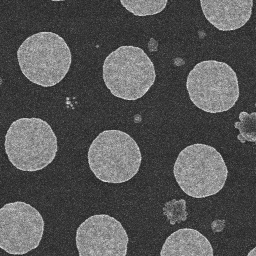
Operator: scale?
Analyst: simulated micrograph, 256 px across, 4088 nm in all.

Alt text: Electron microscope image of raised bodies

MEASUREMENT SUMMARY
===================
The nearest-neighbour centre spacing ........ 1360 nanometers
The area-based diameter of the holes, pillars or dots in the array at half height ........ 843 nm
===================